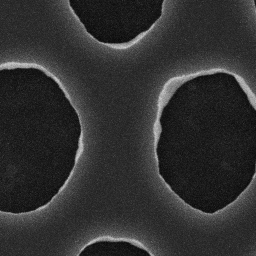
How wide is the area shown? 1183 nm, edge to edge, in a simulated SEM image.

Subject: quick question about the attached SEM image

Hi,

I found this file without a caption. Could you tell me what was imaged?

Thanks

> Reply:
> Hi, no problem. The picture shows holes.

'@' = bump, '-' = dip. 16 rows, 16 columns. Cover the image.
@@@@------@@@@@@
@@@@@-----@@@@@@
@@@@@@--@@@@@@@@
@@@@@@@@@@@@@@@@
---@@@@@@@@@@-@@
----@@@@@@@----@
----@@@@@@------
-----@@@@@------
-----@@@@@------
-----@@@@@------
-----@@@@@------
----@@@@@@------
---@@@@@@@@----@
@@@@@@@@@@@@@@@@
@@@@@@@@@@@@@@@@
@@@@@----@@@@@@@